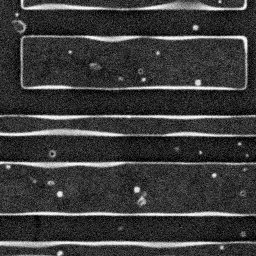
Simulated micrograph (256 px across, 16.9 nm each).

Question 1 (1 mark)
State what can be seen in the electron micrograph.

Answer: groups of lines, slits or small figures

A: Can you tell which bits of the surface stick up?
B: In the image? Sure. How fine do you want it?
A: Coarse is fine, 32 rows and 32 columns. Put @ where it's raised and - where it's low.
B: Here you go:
---@@@@@@@@@@@@@@@@@@@@@@@@@@@@-
--------------------------------
--------------------------------
--------------------------------
--------------------------------
---@@@@@@@@@@@@@@@@@@@@@@@@@@@@-
---@@@@@@@@@@@@@@@@@@@@@@@@@@@@-
---@@@@@@@@@@@@@@@@@@@@@@@@@@@@-
---@@@@@@@@@@@@@@@@@@@@@@@@@@@@-
---@@@@@@@@@@@@@@@@@@@@@@@@@@@@-
---@@@@@@@@@@@@@@@@@@@@@@@@@@@@-
--------------------------------
--------------------------------
--------------------------------
--------------------------------
@@@@@@@@@@@@@@@@@@@@@@@@@@@@@@@@
@@@@@@@-@@@@@@@@@@@@@@@@@@@@@@@@
--------------------------------
--------------------------------
--------------------------------
@@@@----------@@@@@@@@@@@@@@@@@@
@@@@@@@@@@@@@@@@@@@@@@@@@@@@@@@@
@@@@@@@@@@@@@@@@@@@@@@@@@@@@@@@@
@@@@@@@@@@@@@@@@@@@@@@@@@@@@@@@@
@@@@@@@@@@@@@@@@@@@@@@@@@@@@@@@@
@@@@@@@@@@@@@@@@@@@@@@@@@@@@@@@@
@@@@@@@@@@@@@@@@@@@@@@@@@@@@@@@@
--------------------------------
--------------------------------
--------------------------------
------@@@@@-@@@@@-------@@@@@@@@
@@@@@@@@@@@@@@@@@@@@@@@@@@@@@@@@